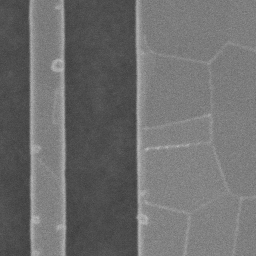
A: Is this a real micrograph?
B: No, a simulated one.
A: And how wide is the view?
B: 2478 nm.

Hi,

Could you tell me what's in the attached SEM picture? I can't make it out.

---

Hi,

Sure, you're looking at wiring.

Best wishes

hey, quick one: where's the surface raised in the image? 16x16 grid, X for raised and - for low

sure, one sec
--XX-----XXXXXXX
--XX-----XXXXXXX
--XX-----XXXXXXX
--XX-----XXXXXXX
--XX-----XXXXXXX
--XX-----XXXXXXX
--XX-----XXXXXXX
--XX-----XXXXXXX
--XX-----XXXXXXX
--XX-----XXXXXXX
--XX-----XXXXXXX
--XX-----XXXXXXX
--XX-----XXXXXXX
--XX-----XXXXXXX
--XX-----XXXXXXX
--XX-----XXXXXXX